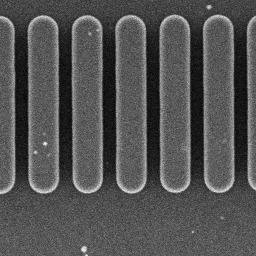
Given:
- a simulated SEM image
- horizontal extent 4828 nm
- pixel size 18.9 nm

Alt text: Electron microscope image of groups of lines, slits or small figures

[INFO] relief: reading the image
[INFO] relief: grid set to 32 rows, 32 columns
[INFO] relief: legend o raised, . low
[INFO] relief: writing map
................................
................................
o...ooo...oo...ooo...oo...ooo..o
oo..ooo..oooo.oooo..oooo.oooo..o
oo.oooo..oooo.oooo..oooo.oooo..o
oo..ooo..oooo..ooo..oooo.oooo..o
oo..ooo..oooo..ooo..oooo.oooo..o
oo..ooo..oooo..ooo..oooo.oooo..o
oo..ooo..oooo.oooo..oooo.oooo..o
oo..ooo..oooo..ooo..oooo.oooo..o
oo..ooo..oooo..ooo..oooo.oooo..o
oo..ooo..oooo..ooo..oooo..ooo..o
oo..ooo..oooo..ooo..oooo..ooo..o
oo..ooo..oooo..ooo..oooo..ooo..o
oo..ooo..oooo..ooo..oooo..ooo..o
oo..ooo..oooo..ooo..oooo..ooo..o
oo..ooo..oooo..ooo..oooo..ooo..o
oo..ooo..oooo..ooo..oooo..ooo..o
oo..ooo..oooo..ooo..oooo..ooo..o
oo..ooo..oooo..ooo..oooo..ooo..o
oo..ooo..oooo..ooo..oooo..ooo..o
oo..ooo..oooo..ooo..oooo..ooo..o
oo..ooo..oooo..ooo..oooo..ooo..o
o...ooo...oo...ooo...oo...ooo...
................................
................................
................................
................................
................................
................................
................................
................................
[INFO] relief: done